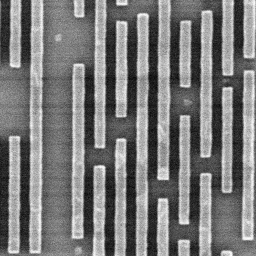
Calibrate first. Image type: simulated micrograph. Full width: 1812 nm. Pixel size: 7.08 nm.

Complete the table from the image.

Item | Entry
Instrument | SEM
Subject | wiring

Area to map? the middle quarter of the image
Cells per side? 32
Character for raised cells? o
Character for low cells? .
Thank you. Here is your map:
...oo...oo...ooo...oo...oo...oo.
..ooo...oo...ooo...oo...oo...oo.
..ooo...oo...ooo...oo...oo...oo.
..ooo...oo...ooo...oo...oo...oo.
..ooo...oo...ooo...oo...oo...oo.
..ooo...oo...oo....oo...oo....o.
..ooo...oo...oo....oo...oo......
..ooo...oo...oo....oo...oo......
..ooo...oo...oo....oo...oo......
..ooo...oo...oo....oo...oo......
..ooo...oo...oo....oo...oo......
..ooo...oo...oo....oo...oo......
..ooo...oo...oo....oo...oo......
..ooo...oo.........oo...oo...oo.
..ooo...oo........ooo...oo...oo.
..ooo...oo........ooo...oo...oo.
..ooo...oo.........oo...oo...oo.
..ooo...oo.........oo...oo...oo.
..ooo...oo........ooo...oo...oo.
..ooo...oo...oo...ooo...oo...oo.
..ooo...oo...oo...ooo...oo...oo.
..ooo........oo...ooo...oo...oo.
..ooo........oo....oo...oo...oo.
..ooo........oo...ooo...oo...oo.
..ooo........oo...ooo...oo...oo.
..ooo........oo...ooo...oo...oo.
..ooo...oo...oo...ooo...oo...oo.
..ooo...oo...oo...ooo...oo...oo.
..ooo...oo...oo...ooo..ooo...oo.
..ooo...oo...oo...ooo........oo.
..ooo...oo...oo...ooo........oo.
..ooo...oo...oo...ooo........oo.